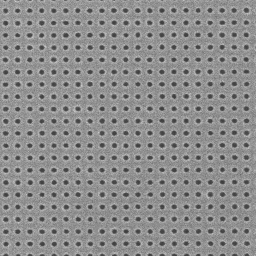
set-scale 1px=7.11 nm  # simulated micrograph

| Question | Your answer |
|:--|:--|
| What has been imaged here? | a regular array of holes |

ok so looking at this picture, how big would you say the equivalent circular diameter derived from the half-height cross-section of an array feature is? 34 nanometers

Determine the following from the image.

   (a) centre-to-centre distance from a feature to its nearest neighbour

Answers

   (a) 84.3 nm